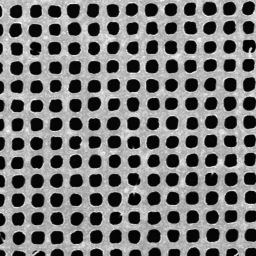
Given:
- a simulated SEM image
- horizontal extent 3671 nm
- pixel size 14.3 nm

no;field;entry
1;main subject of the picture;a regular array of holes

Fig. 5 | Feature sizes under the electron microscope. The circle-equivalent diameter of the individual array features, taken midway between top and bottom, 13.3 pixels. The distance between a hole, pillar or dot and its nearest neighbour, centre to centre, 266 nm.